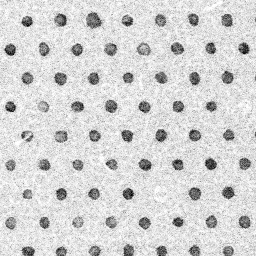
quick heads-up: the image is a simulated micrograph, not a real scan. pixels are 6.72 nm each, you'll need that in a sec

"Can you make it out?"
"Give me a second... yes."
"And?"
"a regular array of holes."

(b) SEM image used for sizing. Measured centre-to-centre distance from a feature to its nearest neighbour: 220 nm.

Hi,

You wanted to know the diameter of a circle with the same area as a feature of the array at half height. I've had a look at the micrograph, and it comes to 84.8 nm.